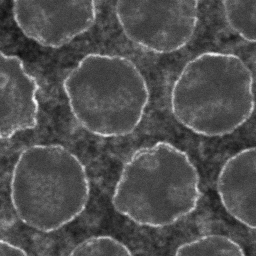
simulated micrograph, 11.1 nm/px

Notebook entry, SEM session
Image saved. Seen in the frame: raised bodies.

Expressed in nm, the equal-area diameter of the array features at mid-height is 893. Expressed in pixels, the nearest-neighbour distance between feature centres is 106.